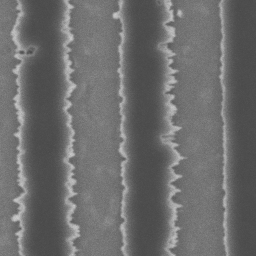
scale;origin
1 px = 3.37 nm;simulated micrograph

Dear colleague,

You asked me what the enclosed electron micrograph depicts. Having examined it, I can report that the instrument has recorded one or a few lines or trenches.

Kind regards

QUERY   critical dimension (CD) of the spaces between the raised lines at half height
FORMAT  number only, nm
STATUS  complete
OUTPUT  165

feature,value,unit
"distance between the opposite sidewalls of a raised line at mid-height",0.177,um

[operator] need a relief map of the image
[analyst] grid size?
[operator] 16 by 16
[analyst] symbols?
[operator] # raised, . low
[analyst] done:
.###...####...##
.###....###...##
.###....###...##
.###...####...##
.###...####...##
.####...###...##
.###....###...##
.###....###...##
.####...###...##
.####...###...##
.###....###...##
.###....###...##
.####...###...##
.###....###...##
.####...###...##
.####...###...##